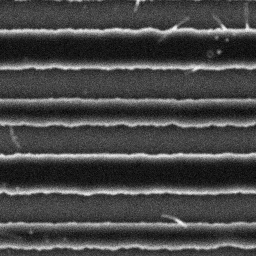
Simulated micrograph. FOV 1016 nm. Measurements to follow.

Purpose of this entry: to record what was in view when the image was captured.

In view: lines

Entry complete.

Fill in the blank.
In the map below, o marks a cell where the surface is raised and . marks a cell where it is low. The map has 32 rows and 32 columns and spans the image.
................................
................................
................................
................................
oooooooooooooooooooooooooooooooo
oooooooooooooooooooooooooooooooo
oooooooooooooooooooooooooooooooo
oooooooooooooooooooooooooooooooo
ooo..o..oo..ooo.o..ooooooooo...o
................................
................................
................................
oooooooooooooooooooooo.o.ooooooo
oooooooooooooooooooooooooooooooo
oooooooooooooooooooooooooooooooo
ooooooooooooooo.ooooo.oooooooooo
................................
................................
................................
oooooooooooooooooooooooooooooooo
oooooooooooooooooooooooooooooooo
oooooooooooooooooooooooooooooooo
oooooooooooooooooooooooooooooooo
oooooooooooooooooooooooooooooooo
................................
................................
................................
................................
oooooooooooooooooooooooooooooooo
oooooooooooooooooooooooooooooooo
oooooooooooooooooooooooooooooooo
................................